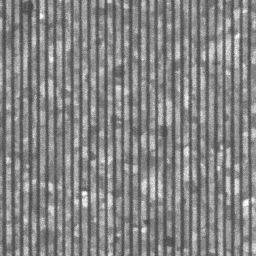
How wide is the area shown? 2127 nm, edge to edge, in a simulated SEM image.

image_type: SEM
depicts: parallel lines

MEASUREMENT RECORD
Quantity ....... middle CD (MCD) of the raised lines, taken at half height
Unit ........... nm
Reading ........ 35.3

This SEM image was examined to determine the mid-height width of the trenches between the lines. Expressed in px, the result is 4.38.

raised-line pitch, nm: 70.3